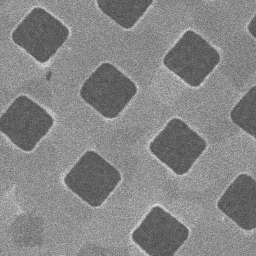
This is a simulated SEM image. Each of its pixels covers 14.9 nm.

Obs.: holes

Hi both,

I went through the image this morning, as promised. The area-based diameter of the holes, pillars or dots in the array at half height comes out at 0.758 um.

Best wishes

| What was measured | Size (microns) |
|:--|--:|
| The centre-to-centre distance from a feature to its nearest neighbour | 1.09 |